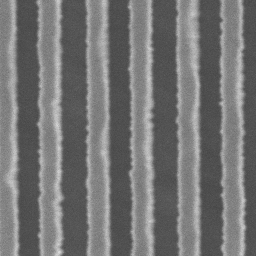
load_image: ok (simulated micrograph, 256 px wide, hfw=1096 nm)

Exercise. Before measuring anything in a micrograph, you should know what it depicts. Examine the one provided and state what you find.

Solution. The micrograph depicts lines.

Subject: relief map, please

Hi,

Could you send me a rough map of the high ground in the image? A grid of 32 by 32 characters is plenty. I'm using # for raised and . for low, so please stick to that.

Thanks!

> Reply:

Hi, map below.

##...###...##...###...###...##..
##...###...##...###...###...##..
##...###...##...###...###...##..
##...###...##...###...###...##..
##...###...##...###...###...##..
##...###...##...###...###...##..
##...###...##...###...###...##..
##...###...###..###...###...##..
##...###...###..###...###...##..
##...###...###..###...###...##..
##...###...###..###...###...##..
##...###...###..###...###...##..
##...###...###..###...###...##..
##...###...###..###...###...##..
##...###...###..###...###...##..
##...###...###..###...###...##..
##...###...###..###...###...###.
##...###...###..###...###...##..
##...###...###..###...###...##..
##...###...###..###...###...##..
##...###...###..###...###...##..
##...###...###..###...###...##..
##...###...###..###...###...##..
##...###...###..###...###...##..
##...###...###...##...###...###.
##...###...###...##...###...###.
##...###...###..###...###...###.
##...###...###...##...###...###.
##...###...###..###...###...###.
##...###...###..###...###...###.
##...###...###...##...###...###.
##...###...###..###...###...###.